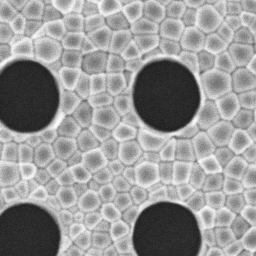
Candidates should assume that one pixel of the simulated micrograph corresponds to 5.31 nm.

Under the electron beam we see holes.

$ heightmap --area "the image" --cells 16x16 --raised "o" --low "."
oooooooooooooooo
oooooooooooooooo
oooooooooooooooo
oooooooooooooooo
...oooooo...oooo
....oooo....oooo
....oooo....oooo
...oooooo...oooo
oooooooooooooooo
oooooooooooooooo
oooooooooooooooo
oooooooooooooooo
oooooooooooooooo
...oooooo...oooo
....oooo.....ooo
....oooo.....ooo